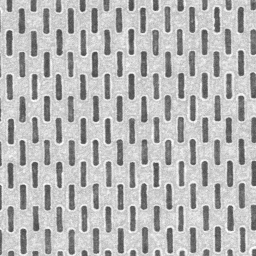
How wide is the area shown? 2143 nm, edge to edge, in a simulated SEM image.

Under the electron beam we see a regular array of holes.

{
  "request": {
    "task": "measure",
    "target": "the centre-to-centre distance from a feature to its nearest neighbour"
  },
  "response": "200 nanometres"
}